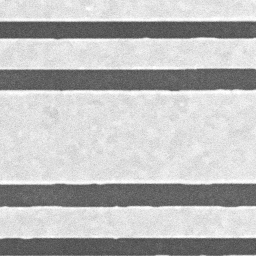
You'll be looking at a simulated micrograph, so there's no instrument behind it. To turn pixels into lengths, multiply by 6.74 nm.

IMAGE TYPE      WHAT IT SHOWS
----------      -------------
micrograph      lines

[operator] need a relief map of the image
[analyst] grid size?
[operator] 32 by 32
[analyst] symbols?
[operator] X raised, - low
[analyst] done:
XXXXXXXXXXXXXXXXXXXXXXXXXXXXXXXX
XXXXXXXXXXXXXXXXXXXXXXXXXXXXXXXX
XXXXXXXXXXXXXXXXXXXXXXXXXXXXXXXX
--------------------------------
--------------------------------
XXXXXXXXXXXXXXXXXXXXXXXXXXXXXXXX
XXXXXXXXXXXXXXXXXXXXXXXXXXXXXXXX
XXXXXXXXXXXXXXXXXXXXXXXXXXXXXXXX
XXXXXXXXXXXXXXXXXXXXXXXXX-------
--------------------------------
--------------------------------
XXXXXXXXXXXXXXXXXXXXXXXXXXXXXXXX
XXXXXXXXXXXXXXXXXXXXXXXXXXXXXXXX
XXXXXXXXXXXXXXXXXXXXXXXXXXXXXXXX
XXXXXXXXXXXXXXXXXXXXXXXXXXXXXXXX
XXXXXXXXXXXXXXXXXXXXXXXXXXXXXXXX
XXXXXXXXXXXXXXXXXXXXXXXXXXXXXXXX
XXXXXXXXXXXXXXXXXXXXXXXXXXXXXXXX
XXXXXXXXXXXXXXXXXXXXXXXXXXXXXXXX
XXXXXXXXXXXXXXXXXXXXXXXXXXXXXXXX
XXXXXXXXXXXXXXXXXXXXXXXXXXXXXXXX
XXXXXXXXXXXXXXXXXXXXXXXXXXXXXXXX
XXXXXXXXXXXXXXXXXXXXXXXXXXXXXXXX
--------------------------------
--------------------------------
--------------------------------
XXXXXXXXXXXXXXXXXXXXXXXXXXXXXXXX
XXXXXXXXXXXXXXXXXXXXXXXXXXXXXXXX
XXXXXXXXXXXXXXXXXXXXXXXXXXXXXXXX
XXXXXXXXXXXXXXXXXXXXXXXXXXXXXXXX
--------------------------------
--------------------------------